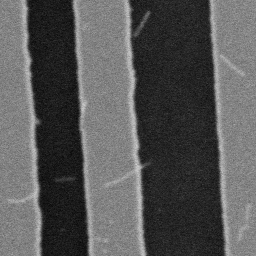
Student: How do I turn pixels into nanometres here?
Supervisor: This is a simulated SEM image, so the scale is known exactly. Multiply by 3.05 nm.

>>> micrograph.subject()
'lines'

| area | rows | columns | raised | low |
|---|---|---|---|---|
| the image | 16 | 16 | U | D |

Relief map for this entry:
UUDDDUUUDDDDDUUU
UUDDDUUUDDDDDUUU
UUDDDUUUDDDDDUUU
UUDDDUUUDDDDDUUU
UUDDDUUUDDDDDUUU
UUDDDUUUDDDDDUUU
UUDDDUUUDDDDDUUU
UUDDDUUUDDDDDDUU
UUDDDUUUUDDDDDUU
UUDDDUUUUDDDDDUU
UUDDDUUUUDDDDDUU
UUDDDUUUUDDDDDUU
UUDDDUUUUDDDDDUU
UUUDDUUUUDDDDDUU
UUUDDDUUUDDDDDUU
UUUDDDUUUDDDDDUU